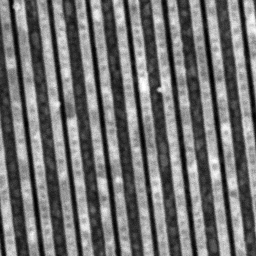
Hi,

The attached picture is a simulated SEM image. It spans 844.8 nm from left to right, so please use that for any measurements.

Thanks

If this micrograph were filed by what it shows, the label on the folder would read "parallel lines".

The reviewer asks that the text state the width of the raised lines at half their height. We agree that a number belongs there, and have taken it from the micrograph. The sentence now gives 29.1 nm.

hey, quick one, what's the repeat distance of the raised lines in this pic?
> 62.5 nanometres